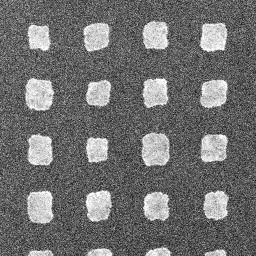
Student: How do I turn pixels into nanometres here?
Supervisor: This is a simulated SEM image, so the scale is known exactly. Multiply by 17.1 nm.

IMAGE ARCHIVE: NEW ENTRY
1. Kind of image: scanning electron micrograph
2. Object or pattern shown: a regular array of raised bodies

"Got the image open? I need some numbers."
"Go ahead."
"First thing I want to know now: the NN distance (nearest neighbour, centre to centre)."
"56.6 px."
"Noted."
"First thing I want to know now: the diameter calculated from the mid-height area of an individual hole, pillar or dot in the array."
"461 nanometres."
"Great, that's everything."